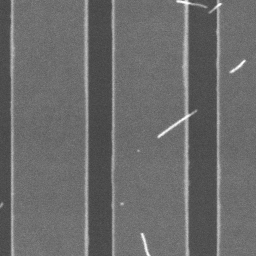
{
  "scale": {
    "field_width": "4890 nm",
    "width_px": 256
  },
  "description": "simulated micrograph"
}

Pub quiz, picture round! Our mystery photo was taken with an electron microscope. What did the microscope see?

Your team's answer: lines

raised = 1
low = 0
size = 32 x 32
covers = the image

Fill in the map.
01111111111000111111111100011111
01111111111000111111111000011111
01111111111000111111111000011111
01111111111000111111111000011111
01111111111000111111111000011111
01111111111000111111111000011111
01111111111000111111111000011111
01111111111000111111111000011111
01111111111000111111111000011111
01111111111000111111111000011111
01111111111000111111111000011111
01111111111000111111111000011111
01111111111000111111111000011111
01111111111000111111111000011111
01111111111000111111111100011111
01111111111000111111111000011111
01111111111000111111111000011111
01111111111000111111111000011111
01111111111000111111111000011111
01111111111000111111111000011111
01111111111000111111111000011111
01111111111000111111111000011111
01111111111000111111111000011111
01111111111000111111111000011111
01111111111000111111111000011111
01111111111000111111111000011111
01111111111000111111111000011111
01111111111000111111111000011111
01111111111000111111111000011111
01111111111000111111111000011111
01111111111000111111111000011111
01111111111000111111111000011111